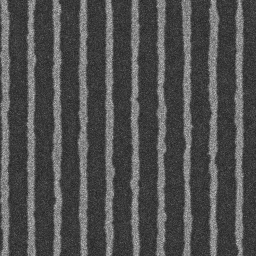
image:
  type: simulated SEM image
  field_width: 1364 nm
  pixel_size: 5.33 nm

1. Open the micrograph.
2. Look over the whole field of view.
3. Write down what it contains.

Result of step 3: parallel lines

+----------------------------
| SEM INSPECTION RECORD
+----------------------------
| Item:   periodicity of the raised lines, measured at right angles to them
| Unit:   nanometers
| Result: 139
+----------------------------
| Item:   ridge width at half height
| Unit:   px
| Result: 6.75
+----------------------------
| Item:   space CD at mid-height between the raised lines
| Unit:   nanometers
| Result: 103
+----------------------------